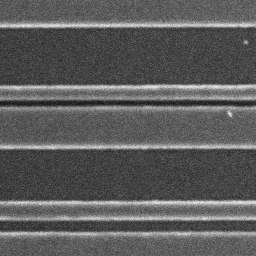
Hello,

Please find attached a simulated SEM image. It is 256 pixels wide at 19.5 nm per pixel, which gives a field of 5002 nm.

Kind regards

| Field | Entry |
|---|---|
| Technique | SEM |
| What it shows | lines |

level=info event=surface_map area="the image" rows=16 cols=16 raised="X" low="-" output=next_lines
XXXXXXXXXXXXXXXX
XXXXXXXXXXXXXXXX
----------------
----------------
----------------
XXXXXXXXXXXXXXXX
XXXXXXXXXXXXXXXX
XXXXXXXXXXXXXXXX
XXXXXXXXXXXXXXXX
----------------
----------------
----------------
----------------
XXXXXXXXXXXXXXXX
XXXXXXXXXXXXXXXX
XXXXXXXXXXXXXXXX